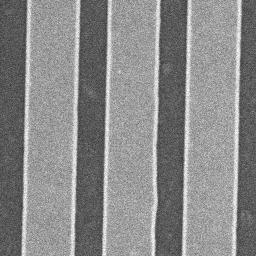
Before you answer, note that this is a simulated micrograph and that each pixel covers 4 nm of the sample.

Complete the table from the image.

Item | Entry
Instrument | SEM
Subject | one or a few lines or trenches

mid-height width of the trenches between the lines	122	nm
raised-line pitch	322	nm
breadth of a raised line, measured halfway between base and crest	200	nm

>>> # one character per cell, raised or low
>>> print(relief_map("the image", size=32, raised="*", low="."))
....******....******....******..
....******....******....******..
....******....******....******..
....******....******....******..
....******....******....******..
....******....******....******..
....******....******....******..
....******....******....******..
....*****.....******....******..
....*****.....******....******..
...******.....******...*******..
...******....*******...*******..
...******....*******...*******..
...******.....*****....*******..
...******.....*****....*******..
...******....******....*******..
...******....******....*******..
...******....******....*******..
...******....******....******...
...******....******....******...
...******....******....******...
...******....******....******...
...******....******....******...
...******....******....******...
...******....******....******...
...******....******....******...
...******....******....******...
...******....******....******...
...******....******....******...
...******....******....******...
...******....******....******...
...******....******....******...